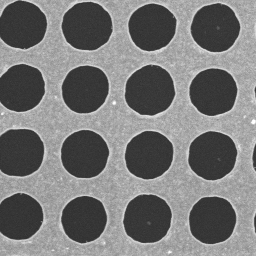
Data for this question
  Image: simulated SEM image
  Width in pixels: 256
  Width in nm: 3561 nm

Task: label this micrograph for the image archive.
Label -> a regular array of holes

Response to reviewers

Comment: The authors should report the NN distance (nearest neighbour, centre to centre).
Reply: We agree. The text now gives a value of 881 nanometers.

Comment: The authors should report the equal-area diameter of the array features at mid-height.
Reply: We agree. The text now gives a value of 0.677 micrometres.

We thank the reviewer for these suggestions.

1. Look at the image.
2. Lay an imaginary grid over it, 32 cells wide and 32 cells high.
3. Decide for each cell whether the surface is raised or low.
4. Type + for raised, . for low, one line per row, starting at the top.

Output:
+...++++++..+++++++.+++++++.++++
.....+++.....++++....++++....+++
......++......++......++......++
......++......++......++......++
......++......++......++......++
+....++++....++++....++++....+++
++++++++++++++++++++++++++++++++
++++++++++++++++++++++++++++++++
+...+++++...++++++..++++++++++++
.....+++.....+++.....++++....+++
......++......++......++.....+++
......++.....+++......++......++
.....+++.....+++......++.....+++
+...+++++...++++.....+++.....+++
++++++++++++++++++++++++++++++++
++++++++++++++++++++++++++++++++
+...+++++...++++++.+++++++.+++++
.....+++.....+++.....+++.....+++
.....+++......++......++......++
.....+++......++......++......++
.....+++.....+++.....+++.....+++
....++++.....+++.....+++.....+++
++++++++++++++++++++++++++.+++++
++++++++++++++++++++++++++++++++
+...+++++++++++++...++++++++++++
.....+++.....+++.....+++.....+++
.....+++.....+++.....+++.....+++
.....+++.....++......+++......++
.....+++.....+++.....+++.....+++
+...++++....++++.....+++.....+++
++++++++++++++++++++++++++++++++
++++++++++++++++++++++++++++++++